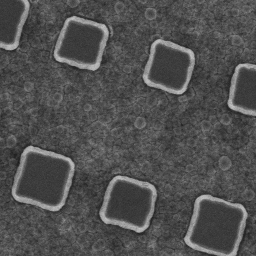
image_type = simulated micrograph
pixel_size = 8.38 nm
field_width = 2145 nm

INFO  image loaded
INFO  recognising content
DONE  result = raised bodies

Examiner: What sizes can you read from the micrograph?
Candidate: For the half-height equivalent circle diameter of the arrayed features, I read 420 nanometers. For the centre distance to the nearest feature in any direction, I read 756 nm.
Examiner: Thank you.